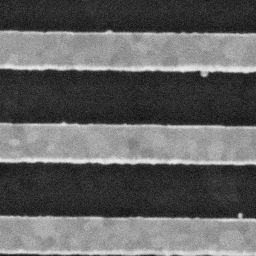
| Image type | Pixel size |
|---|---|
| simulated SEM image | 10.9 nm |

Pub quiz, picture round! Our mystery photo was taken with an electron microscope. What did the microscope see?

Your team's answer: lines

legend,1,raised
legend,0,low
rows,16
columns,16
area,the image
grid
0000000000000000
0000000000000000
1111111111111111
1111111111111111
0000000000000000
0000000000000000
0000000000000000
0000000000000000
1111111111111111
1111111111111111
0000000000000000
0000000000000000
0000000000000000
0000000000000000
1111111111111111
1111111111111111